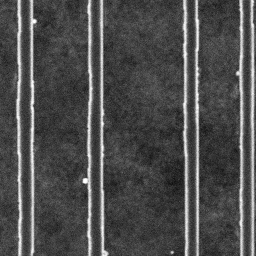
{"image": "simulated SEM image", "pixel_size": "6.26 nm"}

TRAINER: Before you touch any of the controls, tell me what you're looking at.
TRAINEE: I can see lines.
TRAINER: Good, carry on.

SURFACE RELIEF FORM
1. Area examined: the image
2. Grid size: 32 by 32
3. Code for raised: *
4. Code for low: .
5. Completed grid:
..**.......**..........**.....**
..**.......**..........**.....**
..**.......**..........**.....**
..**.......**..........**.....**
..**.......**..........**.....**
..**.......**..........**.....**
..**.......**..........**.....**
..**.......**..........**.....**
..**.......**..........**.....**
..**.......**..........**.....**
..**.......**..........**.....**
..**.......**..........**.....**
..**.......**..........**.....**
..**.......**..........**.....**
..**.......**..........**.....**
..**.......**..........**.....**
..**.......**..........**.....**
..**.......**..........**.....**
..**.......**..........**.....**
..**.......**..........**.....**
..**.......**..........**.....**
..**.......**..........**.....**
..**.......**..........**.....**
..**.......**..........**.....**
..**.......**..........**.....**
..**.......**..........**.....**
...*.......**..........**.....**
..**.......**..........**.....**
..**.......**..........**.....**
..**.......**..........**.....**
..**.......**..........**.....**
..**.......**..........**.....**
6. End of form